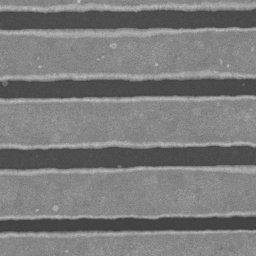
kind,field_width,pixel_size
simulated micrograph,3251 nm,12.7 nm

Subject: lines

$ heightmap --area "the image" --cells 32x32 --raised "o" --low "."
oooooooooooooooooooooooooooooooo
................................
................................
................................
oooooooooooooooooooooooooooooooo
oooooooooooooooooooooooooooooooo
oooooooooooooooooooooooooooooooo
oooooooooooooooooooooooooooooooo
oooooooooooooooooooooooooooooooo
oooooooooooooooooooooooooooooooo
................................
................................
oooooooooooooooooooooooooooooooo
oooooooooooooooooooooooooooooooo
oooooooooooooooooooooooooooooooo
oooooooooooooooooooooooooooooooo
oooooooooooooooooooooooooooooooo
oooooooooooooooooooooooooooooooo
..ooooo.........................
................................
................................
oooooooooooooooooooooooooooooooo
oooooooooooooooooooooooooooooooo
oooooooooooooooooooooooooooooooo
oooooooooooooooooooooooooooooooo
oooooooooooooooooooooooooooooooo
oooooooooooooooooooooooooooooooo
................................
................................
oooooooooooooooooooooooooooooooo
oooooooooooooooooooooooooooooooo
oooooooooooooooooooooooooooooooo